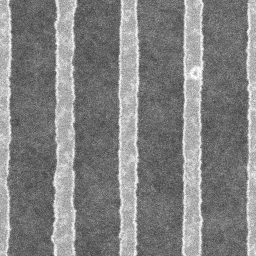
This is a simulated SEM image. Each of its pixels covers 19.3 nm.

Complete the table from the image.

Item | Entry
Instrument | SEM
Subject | one or a few lines or trenches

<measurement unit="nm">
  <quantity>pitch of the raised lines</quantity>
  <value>1240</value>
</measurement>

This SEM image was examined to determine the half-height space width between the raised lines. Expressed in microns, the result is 0.921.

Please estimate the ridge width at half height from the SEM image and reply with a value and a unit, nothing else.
313 nm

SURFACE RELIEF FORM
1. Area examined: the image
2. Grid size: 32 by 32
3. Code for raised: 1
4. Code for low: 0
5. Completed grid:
10000001100000011000000110000001
10000001100000011000000110000001
10000001100000011000000110000001
10000001100000011000000110000001
10000001100000011000000110000001
10000001100000011000000110000001
10000001100000011000000110000001
10000001100000011000000110000001
10000001100000011000000110000001
10000001100000011000000110000001
10000001100000011000000110000001
10000001100000011000000110000001
10000001100000011000000110000001
10000001100000011000000110000001
10000001100000011000000110000001
10000001100000011000000110000001
10000001100000011000000110000001
10000001100000011000000110000001
10000001100000011000000110000001
10000001100000011000000110000001
10000001100000011000000110000001
10000001100000011000000110000001
10000001100000011000000110000001
10000001100000011000000110000001
10000001100000011000000110000001
10000001100000011000000110000001
10000001100000011000000110000001
10000001100000011000000110000001
10000001100000011000000110000001
10000001100000011000000110000001
10000001100000011000000110000001
10000001100000011000000110000001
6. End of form